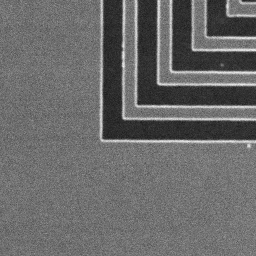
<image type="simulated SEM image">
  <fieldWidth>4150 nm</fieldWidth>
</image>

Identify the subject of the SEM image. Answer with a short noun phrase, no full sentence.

groups of lines, slits or small figures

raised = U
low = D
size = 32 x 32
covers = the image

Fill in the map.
UUUUUUUUUUUUUDDDUDDDUDDDUUDDUUUU
UUUUUUUUUUUUUDDDUDDDUDDDUUDDUUUU
UUUUUUUUUUUUUDDDUDDDUDDDUUDDDDDD
UUUUUUUUUUUUUDDUUDDDUDDDUUDDDDDD
UUUUUUUUUUUUUDDUUDDDUDDDUUDDDDDD
UUUUUUUUUUUUUDDUUDDDUDDDUUUUUUUU
UUUUUUUUUUUUUDDUUDDDUDDDDDDDDDDD
UUUUUUUUUUUUUDDUUDDDUDDDDDDDDDDD
UUUUUUUUUUUUUDDUUDDDUDDDDDDDDDDD
UUUUUUUUUUUUUDDUUDDDUUUUUUUUUUUU
UUUUUUUUUUUUUDDUUDDDUUUUUUUUUUUU
UUUUUUUUUUUUUDDUUDDDDDDDDDDDDDDD
UUUUUUUUUUUUUDDUUDDDDDDDDDDDDDDD
UUUUUUUUUUUUUDDUUUUUUUUUUUUUUUUU
UUUUUUUUUUUUUDDUUUUUUUUUUUUUUUUU
UUUUUUUUUUUUUDDDDDDDDDDDDDDDDDDD
UUUUUUUUUUUUUDDDDDDDDDDDDDDDDDDD
UUUUUUUUUUUUUDDDDDDDDDDDDDDDDDDD
UUUUUUUUUUUUUUUUUUUUUUUUUUUUUUUU
UUUUUUUUUUUUUUUUUUUUUUUUUUUUUUUU
UUUUUUUUUUUUUUUUUUUUUUUUUUUUUUUU
UUUUUUUUUUUUUUUUUUUUUUUUUUUUUUUU
UUUUUUUUUUUUUUUUUUUUUUUUUUUUUUUU
UUUUUUUUUUUUUUUUUUUUUUUUUUUUUUUU
UUUUUUUUUUUUUUUUUUUUUUUUUUUUUUUU
UUUUUUUUUUUUUUUUUUUUUUUUUUUUUUUU
UUUUUUUUUUUUUUUUUUUUUUUUUUUUUUUU
UUUUUUUUUUUUUUUUUUUUUUUUUUUUUUUU
UUUUUUUUUUUUUUUUUUUUUUUUUUUUUUUU
UUUUUUUUUUUUUUUUUUUUUUUUUUUUUUUU
UUUUUUUUUUUUUUUUUUUUUUUUUUUUUUUU
UUUUUUUUUUUUUUUUUUUUUUUUUUUUUUUU